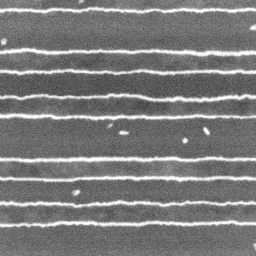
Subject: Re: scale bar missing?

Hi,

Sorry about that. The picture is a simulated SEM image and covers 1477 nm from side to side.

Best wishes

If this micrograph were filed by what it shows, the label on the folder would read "lines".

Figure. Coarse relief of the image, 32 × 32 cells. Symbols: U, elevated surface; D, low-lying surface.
UUUUUUUUUUUUUUUUUUUUUUUUUUUUUUUU
DDDDDDDDDDDDDDDDDDDDDDDDDDDDDDDD
DDDDDDDDDDDDDDDDDDDDDDDDDDDDDDDD
DDDDDDDDDDDDDDDDDDDDDDDDDDDDDDDD
DDDDDDDDDDDDDDDDDDDDDDDDDDDDDDDD
DDDDDDDDDDDDDDDDDDDDDDDDDDDDDDDD
DUUUUDDDDUUUUUUUDUUUUDDDDDDDDDDD
UUUUUUUUUUUUUUUUUUUUUUUUUUUUUUUU
UUUUUUUUUUUUUUUUUUUUUUUUUUUUUUUU
DDDDDDDDDDDDDDDDDDDDDDDDDDDDDDDD
DDDDDDDDDDDDDDDDDDDDDDDDDDDDDDDD
DDDDDDDDDDDDDDDDDDDDDDDDDDDDDDDD
UUUUUUUUUUUUUUUUUUUUUUUUUUUUUUUU
UUUUUUUUUUUUUUUUUUUUUUUUUUUUUUUU
UUDUUUUUUUUUUUUUUUUUUUUUUUUUUUUU
DDDDDDDDDDDDDDDDDDDDDDDDDDDDDDDD
DDDDDDDDDDDDDDDDDDDDDDDDDDDDDDDD
DDDDDDDDDDDDDDDDDDDDDDDDDDDDDDDD
DDDDDDDDDDDDDDDDDDDDDDDDDDDDDDDD
DDDDDDDDDDDDDDDDDDDDDDDDDDDDDDDD
UUUUUUUUUUUUUUUUUUUUUUUUUUUUUUUU
UUUUUUUUUUUUUUUUUUUUUUUUUUUUUUUU
DDDDDDUUUDDDDDDDDDDDDDDDDDDDDDDD
DDDDDDDDDDDDDDDDDDDDDDDDDDDDDDDD
DDDDDDDDDDDDDDDDDDDDDDDDDDDDDDDD
UUDDUUUUDDDDDUUUUUUUDDUUUUUDUUUU
UUUUUUUUUUUUUUUUUUUUUUUUUUUUUUUU
UUUUUUUUUUUUUUUUUUUUUUUUUUUUUUUU
DDDDDDDDDDDDDDDDDDDDDDDDDDDDDDDD
DDDDDDDDDDDDDDDDDDDDDDDDDDDDDDDD
DDDDDDDDDDDDDDDDDDDDDDDDDDDDDDDD
DDDDDDDDDDDDDDDDDDDDDDDDDDDDDDDD